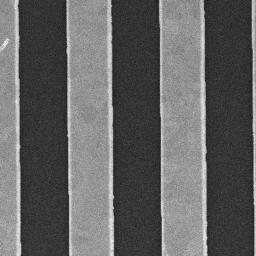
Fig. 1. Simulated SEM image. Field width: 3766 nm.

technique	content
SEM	lines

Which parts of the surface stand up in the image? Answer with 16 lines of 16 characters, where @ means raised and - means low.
@---@@@---@@@---
@---@@@---@@@---
@---@@@---@@@---
@---@@@---@@@---
@---@@@---@@@---
@---@@@---@@@---
@---@@@---@@@---
@---@@@---@@@---
@---@@@---@@@---
@---@@@---@@@---
@---@@@---@@@---
@---@@@---@@@---
@---@@@---@@@---
@---@@@---@@@---
@---@@@---@@@---
@---@@@---@@@---